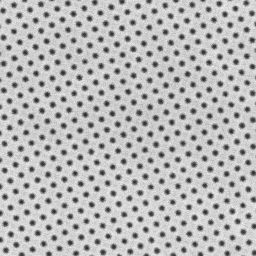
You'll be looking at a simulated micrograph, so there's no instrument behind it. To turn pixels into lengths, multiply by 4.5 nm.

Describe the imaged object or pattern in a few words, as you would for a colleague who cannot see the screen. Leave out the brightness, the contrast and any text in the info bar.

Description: a regular array of holes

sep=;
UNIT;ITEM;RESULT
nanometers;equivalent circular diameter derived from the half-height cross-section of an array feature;25.4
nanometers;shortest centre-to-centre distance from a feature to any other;52.3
